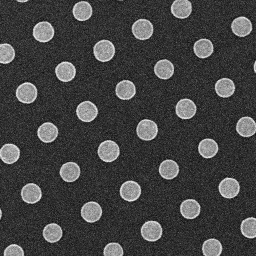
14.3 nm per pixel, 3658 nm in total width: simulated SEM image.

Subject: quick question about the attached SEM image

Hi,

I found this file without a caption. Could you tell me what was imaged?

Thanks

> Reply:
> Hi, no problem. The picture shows a regular array of raised bodies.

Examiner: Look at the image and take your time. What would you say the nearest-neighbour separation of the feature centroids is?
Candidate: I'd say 630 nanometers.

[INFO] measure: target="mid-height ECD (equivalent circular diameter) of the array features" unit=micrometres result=0.285